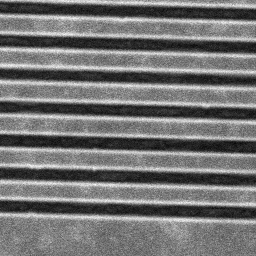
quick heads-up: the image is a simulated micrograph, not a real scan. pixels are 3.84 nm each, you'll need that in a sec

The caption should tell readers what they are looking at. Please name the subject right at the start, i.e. parallel lines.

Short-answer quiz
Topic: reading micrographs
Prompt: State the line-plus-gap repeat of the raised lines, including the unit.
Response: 127 nanometres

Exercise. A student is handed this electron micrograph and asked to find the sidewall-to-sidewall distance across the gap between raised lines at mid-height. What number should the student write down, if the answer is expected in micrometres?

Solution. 0.0522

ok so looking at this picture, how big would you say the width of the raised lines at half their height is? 74.8 nm